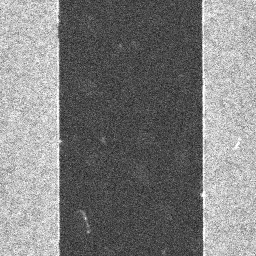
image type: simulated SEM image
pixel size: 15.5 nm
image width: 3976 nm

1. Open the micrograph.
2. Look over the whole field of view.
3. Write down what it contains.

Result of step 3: one or a few lines or trenches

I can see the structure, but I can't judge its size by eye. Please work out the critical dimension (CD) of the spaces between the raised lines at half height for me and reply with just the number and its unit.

2260 nanometres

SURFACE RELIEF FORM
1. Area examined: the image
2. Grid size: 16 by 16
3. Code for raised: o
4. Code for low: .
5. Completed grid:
oooo.........ooo
oooo.........ooo
oooo.........ooo
oooo.........ooo
oooo.........ooo
oooo.........ooo
oooo.........ooo
oooo.........ooo
oooo.........ooo
oooo.........ooo
oooo.........ooo
oooo.........ooo
oooo.........ooo
oooo.........ooo
oooo.........ooo
oooo.........ooo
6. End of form